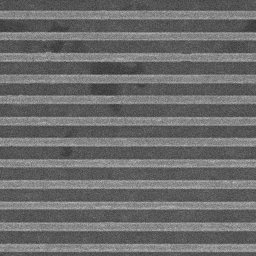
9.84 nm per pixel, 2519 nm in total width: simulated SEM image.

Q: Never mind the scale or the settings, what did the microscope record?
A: parallel lines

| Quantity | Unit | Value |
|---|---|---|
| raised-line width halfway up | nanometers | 71.3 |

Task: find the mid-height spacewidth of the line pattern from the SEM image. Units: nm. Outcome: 141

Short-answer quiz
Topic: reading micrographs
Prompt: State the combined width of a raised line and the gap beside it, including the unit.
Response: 208 nanometres